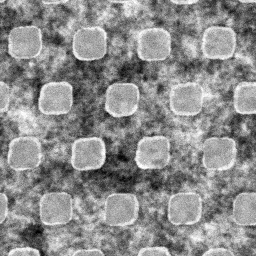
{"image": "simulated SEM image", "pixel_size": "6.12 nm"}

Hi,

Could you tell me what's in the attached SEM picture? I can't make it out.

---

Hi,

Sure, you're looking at a regular array of raised bodies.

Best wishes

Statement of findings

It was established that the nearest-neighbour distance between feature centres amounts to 389 nanometers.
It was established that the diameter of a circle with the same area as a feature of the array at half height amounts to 209 nanometres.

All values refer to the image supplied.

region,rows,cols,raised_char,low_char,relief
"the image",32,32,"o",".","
................................
................................
................................
..ooo.....................oo....
.oooo....oooo....oooo.....ooo...
.oooo....oooo....oooo....oooo...
.oooo....oooo....oooo....oooo...
..................o.............
................................
................................
o.....ooo..............o......oo
o....oooo....oooo....oooo....ooo
o....oooo....oooo....oooo....ooo
o....oooo....oooo....oooo.....oo
..............o.................
................................
................................
..ooo.....ooo.....ooo.....ooo...
.oooo....oooo....oooo.....ooo...
.oooo....oooo....oooo.....ooo...
.oooo....oooo....oooo.....ooo...
................................
................................
................................
o.....ooo.....ooo.....ooo.....oo
o....oooo....oooo....oooo....ooo
o....oooo....oooo....oooo....ooo
.....oooo....oooo....oooo....ooo
................................
................................
................................
.oooo.....oo.....oooo.....ooo...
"